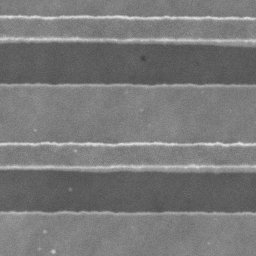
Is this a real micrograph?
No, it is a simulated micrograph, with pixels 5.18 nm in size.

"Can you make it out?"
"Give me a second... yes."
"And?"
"lines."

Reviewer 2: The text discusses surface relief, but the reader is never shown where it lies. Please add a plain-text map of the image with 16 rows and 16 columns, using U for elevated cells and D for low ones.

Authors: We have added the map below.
UUUUUUUUUUUUUUUU
UUUUUUUUUUUUUUUU
DDUDUUUUUUUUUUUU
DDDDDDDDDDDDDDDD
DDDDDDDDDDDDDDDD
UUUUUUUUUUUUUUUU
UUUUUUUUUUUUUUUU
UUUUUUUUUUUUUUUU
UUUUUUUUUUUUUUUU
UUUUUUUUUUUUUUUU
UUDDUUUDDDDDDUDD
DDDDDDDDDDDDDDDD
DDDDDDDDDDDDDDDD
UUUUUUUUUUUUUUUU
UUUUUUUUUUUUUUUU
UUUUUUUUUUUUUUUU